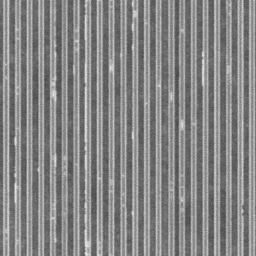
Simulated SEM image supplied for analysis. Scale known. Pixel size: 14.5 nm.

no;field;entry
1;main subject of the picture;parallel lines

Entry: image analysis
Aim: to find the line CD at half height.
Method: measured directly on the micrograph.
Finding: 65.1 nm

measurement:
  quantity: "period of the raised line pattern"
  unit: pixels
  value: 11.7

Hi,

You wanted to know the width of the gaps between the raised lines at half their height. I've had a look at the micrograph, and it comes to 0.103 microns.